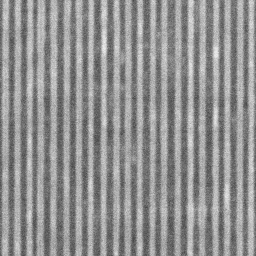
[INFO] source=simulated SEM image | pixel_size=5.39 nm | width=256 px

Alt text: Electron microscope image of parallel lines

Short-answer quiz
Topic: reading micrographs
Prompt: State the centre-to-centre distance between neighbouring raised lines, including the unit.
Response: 66.2 nm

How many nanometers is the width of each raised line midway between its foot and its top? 24.9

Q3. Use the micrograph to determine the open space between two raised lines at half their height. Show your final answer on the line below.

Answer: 7.74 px